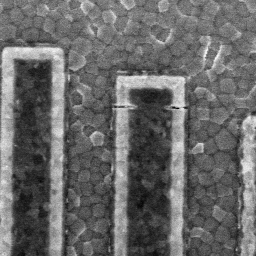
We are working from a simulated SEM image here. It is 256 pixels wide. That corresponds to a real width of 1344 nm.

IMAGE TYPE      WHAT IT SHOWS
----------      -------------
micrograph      one or a few lines or trenches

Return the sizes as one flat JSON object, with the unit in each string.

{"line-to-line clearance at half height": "334 nm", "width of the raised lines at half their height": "0.276 um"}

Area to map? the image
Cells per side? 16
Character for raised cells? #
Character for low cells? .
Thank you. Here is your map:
................
................
................
.##.............
####............
####....###.....
####....###.....
####....###.....
####....###.....
####....###.....
####....###.....
####....###.....
####...####.....
####...####....#
####...####.....
####...####....#